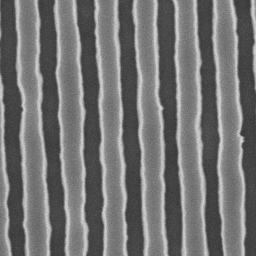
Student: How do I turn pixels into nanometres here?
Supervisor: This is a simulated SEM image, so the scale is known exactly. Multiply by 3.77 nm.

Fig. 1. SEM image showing parallel lines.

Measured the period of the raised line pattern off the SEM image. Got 148 nm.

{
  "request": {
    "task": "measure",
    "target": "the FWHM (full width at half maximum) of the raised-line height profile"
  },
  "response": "80.4 nanometres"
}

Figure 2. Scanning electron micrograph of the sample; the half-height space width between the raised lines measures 17.6 pixels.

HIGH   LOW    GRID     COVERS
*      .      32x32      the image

..***..**...***..***..**...**...
..***..**...***..***..***..**...
..***..**...***..**...***..**...
..***..***..***..***..***..**...
..***..***..***..**...***..***..
..***..***..***..***..***..***..
..***..***..***..***..***..***..
..***..***..***..***..***..***..
..***..***..***..***..***..***..
..***..***..***..***..***..***..
..***..***...**..***..***..***..
...**..***...**..***..***..***..
...**...**..***..***..***..***..
...**..***..***..***..***..***..
...**..***...**..***..***..***..
...**..***...**...**..***..***..
...**...**...**..***..***..***..
...**...**...**..***..***...**..
...**...**...**...**..***..***..
*..***..**...**...**..***..***..
*..***..***..***..**..***..***..
*..***..***..***..**..***..***..
*..***..***..**...**...**..***..
*..***..***..***..***..**..****.
*..***..***..***..***..***.***..
*..***..***..***..**...***.****.
*..***..**...***..**...**...**..
*..***..**...***..***..***..**..
*..***..***..***..**...***..***.
*..***..***..***..***..***..***.
*..***..***..***..***..***..**..
*..***..***..***..***..***..**..